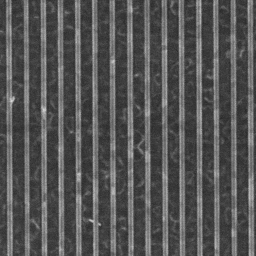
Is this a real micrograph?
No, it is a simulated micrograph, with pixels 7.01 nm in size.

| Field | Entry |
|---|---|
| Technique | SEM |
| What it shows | parallel lines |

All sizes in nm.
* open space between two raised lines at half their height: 91.2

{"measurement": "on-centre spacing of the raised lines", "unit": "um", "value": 0.121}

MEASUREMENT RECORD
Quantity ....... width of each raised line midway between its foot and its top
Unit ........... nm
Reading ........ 26.3